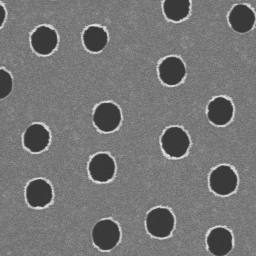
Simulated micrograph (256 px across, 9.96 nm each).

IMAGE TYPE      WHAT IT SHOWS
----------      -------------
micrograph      a regular array of holes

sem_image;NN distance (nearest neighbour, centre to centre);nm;553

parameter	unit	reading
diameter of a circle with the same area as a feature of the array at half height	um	0.27